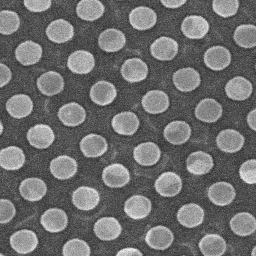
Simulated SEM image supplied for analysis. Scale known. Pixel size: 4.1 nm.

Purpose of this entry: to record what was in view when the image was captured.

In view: a regular array of raised bodies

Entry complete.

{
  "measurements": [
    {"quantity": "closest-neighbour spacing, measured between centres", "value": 153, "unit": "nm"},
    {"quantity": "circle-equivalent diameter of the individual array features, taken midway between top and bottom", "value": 102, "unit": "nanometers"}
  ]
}